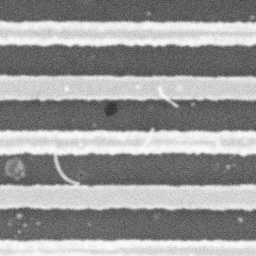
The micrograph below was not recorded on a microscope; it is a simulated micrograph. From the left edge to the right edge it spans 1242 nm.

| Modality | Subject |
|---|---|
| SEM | lines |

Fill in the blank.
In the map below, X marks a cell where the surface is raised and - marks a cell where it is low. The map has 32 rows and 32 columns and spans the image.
--------------------------------
--------------------------------
--------------------------------
XXXXXXXXXXXXXXXXXXXXXXXXXXXXXXXX
XXXXXXXXXXXXXXXXXXXXXXXXXXXXXXXX
--------------------------------
--------------------------------
--------------------------------
--------------------------------
--------------------------------
XXXXXXXXXXXXXXXXXXXXXXXXXXXXXXXX
XXXXXXXXXXXXXXXXXXXXXXXXXXXXXXXX
--------------------------------
--------------------------------
--------------------------------
--------------------------------
--------------------------------
XXXXXXXXXXXXXXXXXXXXXXXXXXXXXXXX
XXXXXXXXXXXXXXXXXXXXXXXXXXXXXXXX
--------------------------------
--------------------------------
--------------------------------
--------------------------------
XXXXXXXXXXXXXXXXXXXXXXXXXXXXXXXX
XXXXXXXXXXXXXXXXXXXXXXXXXXXXXXXX
XXXXXXXXXXXXXXXXXXXXXXXXXXXXXXXX
--------------------------------
--------------------------------
--------------------------------
--------------------------------
X----X--XXXXX-XXXXXXXXXXXXXX--X-
XXXXXXXXXXXXXXXXXXXXXXXXXXXXXXXX